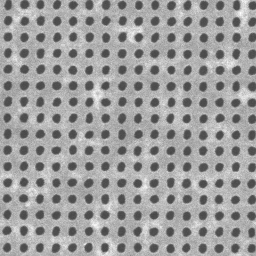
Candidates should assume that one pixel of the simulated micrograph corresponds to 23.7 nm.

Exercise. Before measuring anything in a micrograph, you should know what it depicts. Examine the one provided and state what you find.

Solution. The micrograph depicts a regular array of holes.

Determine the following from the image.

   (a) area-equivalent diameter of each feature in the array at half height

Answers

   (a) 0.219 micrometres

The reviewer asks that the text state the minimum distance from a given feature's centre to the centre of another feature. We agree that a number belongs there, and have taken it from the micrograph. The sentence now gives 376 nm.